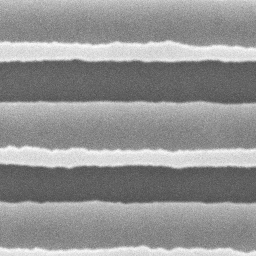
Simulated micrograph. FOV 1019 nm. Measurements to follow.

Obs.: lines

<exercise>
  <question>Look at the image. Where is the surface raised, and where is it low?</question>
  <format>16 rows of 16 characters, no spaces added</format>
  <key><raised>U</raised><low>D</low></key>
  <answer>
UUUUUUUUUUUUUUUU
UUUUUUUUUUUUUUUU
UUUUUUUUUUUUUUUU
UUUUUUUUUUUUUUUU
DDDDDDDDDDDDDDDD
DDDDDDDDDDDDDDDD
UUUUUUUUUUUUUUDU
UUUUUUUUUUUUUUUU
UUUUUUUUUUUUUUUU
UUUUUUUUUUUUUUUU
DDDDDDDDDDDDDDDD
DDDDDDDDDDDDDDDD
DDDDDDDDDDDDDDDD
UUUUUUUUUUUUUUUU
UUUUUUUUUUUUUUUU
UUUUUUUUUUUUUUUU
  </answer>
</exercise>